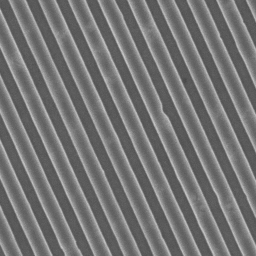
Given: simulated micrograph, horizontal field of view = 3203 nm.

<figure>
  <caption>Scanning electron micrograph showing parallel lines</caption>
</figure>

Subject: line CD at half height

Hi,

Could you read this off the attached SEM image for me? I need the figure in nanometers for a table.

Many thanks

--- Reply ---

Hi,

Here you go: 191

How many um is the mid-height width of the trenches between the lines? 0.145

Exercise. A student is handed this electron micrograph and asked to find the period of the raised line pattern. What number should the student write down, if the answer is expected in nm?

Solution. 339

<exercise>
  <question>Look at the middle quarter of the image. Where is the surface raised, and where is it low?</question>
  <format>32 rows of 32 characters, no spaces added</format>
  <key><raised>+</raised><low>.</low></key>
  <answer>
.++++...+++++...++++...+++++...+
..++++...++++....++++...++++...+
..++++...+++++...++++...++++....
..+++++...++++...+++++...++++...
...++++...+++++...++++...++++...
...++++....++++...++++....++++..
+...++++...++++....++++...++++..
+...++++....++++...++++....++++.
+....++++...++++....++++...++++.
++...++++....++++...++++...+++++
++....++++...++++....+++....++++
+++...++++....++++...++++...++++
+++....++++...++++...++++....+++
++++...++++...+++++...++++...+++
++++...++++....++++...++++....++
+++++...++++...+++++...++++...++
.++++...++++....++++...++++....+
.++++....++++...++++....++++...+
..++++...+++++...++++...++++....
..++++....++++...++++....++++...
...++++...++++...+++++...++++...
...++++....++++...++++....++++..
....++++...++++...+++++...++++..
+...++++...+++++...++++...+++++.
+....++++...++++...+++++...++++.
++...++++...++++....++++...++++.
++...+++++...++++...+++++...++++
+++...++++...++++....++++...++++
+++...++++....++++...++++...++++
++++...++++...++++....++++...+++
++++...++++....++++...++++....++
++++....++++...++++...+++++...++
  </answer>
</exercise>